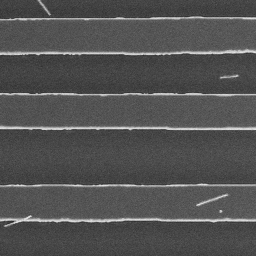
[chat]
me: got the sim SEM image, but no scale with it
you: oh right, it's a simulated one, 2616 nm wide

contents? lines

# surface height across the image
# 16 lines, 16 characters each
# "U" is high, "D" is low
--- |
DDDDDDDDDDDDDDDD
UUUUUUUUUUUUUUUU
UUUUUUUUUUUUUUUU
DDDDDDDDDDDDDDDD
DDDDDDDDDDDDDDDD
DDDDDDDDDDDDDDDD
UUUUUUUUUUUUUUUU
UUUUUUUUUUUUUUUU
DDDDDDDDDDDDDDDD
DDDDDDDDDDDDDDDD
DDDDDDDDDDDDDDDD
DDDDDDDDDDDDDDDD
UUUUUUUUUUUUUUUU
UUUUUUUUUUUUUUUU
DDDDDDDDDDDDDDDD
DDDDDDDDDDDDDDDD